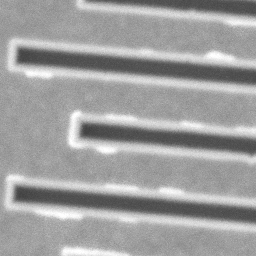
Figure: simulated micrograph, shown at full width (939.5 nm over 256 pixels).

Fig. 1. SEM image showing one or a few lines or trenches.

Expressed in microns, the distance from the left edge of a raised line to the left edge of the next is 0.253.